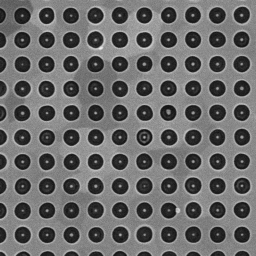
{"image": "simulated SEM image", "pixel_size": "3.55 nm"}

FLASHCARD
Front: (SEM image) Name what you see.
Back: an array of small figures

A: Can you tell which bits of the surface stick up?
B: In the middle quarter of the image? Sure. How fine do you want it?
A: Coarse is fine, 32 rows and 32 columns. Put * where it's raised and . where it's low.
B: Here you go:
....**....**....**....**....**..
...***...****..****..****...***.
********************************
********************************
*..****..****..****..****..****.
....**....**....**....**....**..
....**....**....**....**....**..
...****..****...***...***...***.
********************************
********************************
*..****..****..****..****..****.
....**....**....**....**....**..
....**....**....**....**....**..
....**....**....***...**....***.
********************************
********************************
*..****..****..****..****..*****
....**....**....**....**....**..
....**....**....**....**....**..
....**....**...****...***...***.
**************************.*****
********************************
*..****..****..****..****..****.
....**....**....**....**....**..
....**....**....**....**....**..
....**....**....**....**....***.
********************************
********************************
*******.************.*****.****.
....**....**....**....**....**..
....**....**....**....**....**..
....**....**....**....**....**..